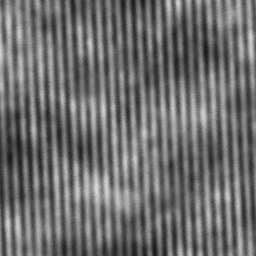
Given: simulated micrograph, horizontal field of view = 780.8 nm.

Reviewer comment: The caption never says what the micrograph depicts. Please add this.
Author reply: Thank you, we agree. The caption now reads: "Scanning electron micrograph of parallel lines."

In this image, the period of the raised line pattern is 30.6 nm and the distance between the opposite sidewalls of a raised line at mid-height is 3.61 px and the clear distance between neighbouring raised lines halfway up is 19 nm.